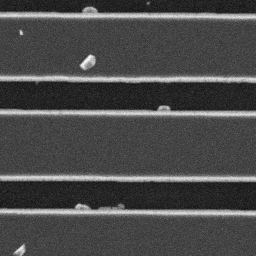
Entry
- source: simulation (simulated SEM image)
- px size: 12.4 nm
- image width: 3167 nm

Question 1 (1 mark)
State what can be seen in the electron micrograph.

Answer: lines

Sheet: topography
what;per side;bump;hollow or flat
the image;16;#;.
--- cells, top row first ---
................
################
################
################
################
................
................
################
################
################
################
................
................
################
################
################